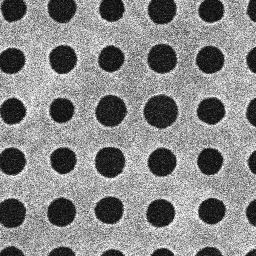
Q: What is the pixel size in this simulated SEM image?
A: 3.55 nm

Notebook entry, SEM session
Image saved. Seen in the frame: a regular array of holes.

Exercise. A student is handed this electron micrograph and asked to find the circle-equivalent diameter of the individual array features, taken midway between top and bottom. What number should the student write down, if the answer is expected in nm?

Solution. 103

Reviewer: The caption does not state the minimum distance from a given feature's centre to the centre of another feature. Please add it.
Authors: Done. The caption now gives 172 nm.